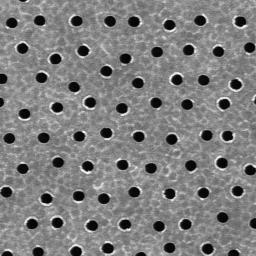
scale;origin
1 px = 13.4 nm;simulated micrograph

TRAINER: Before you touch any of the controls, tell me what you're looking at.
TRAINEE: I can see a regular array of holes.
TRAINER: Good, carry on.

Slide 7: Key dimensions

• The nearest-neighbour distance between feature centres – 371 nm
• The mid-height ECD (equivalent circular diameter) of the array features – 150 nanometers